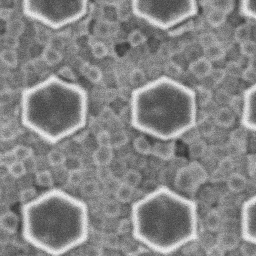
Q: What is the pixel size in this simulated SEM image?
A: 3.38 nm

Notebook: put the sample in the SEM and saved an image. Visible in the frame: raised bodies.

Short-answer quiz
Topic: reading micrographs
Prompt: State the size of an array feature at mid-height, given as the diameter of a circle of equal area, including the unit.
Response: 204 nm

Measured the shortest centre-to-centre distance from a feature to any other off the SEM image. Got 370 nanometres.